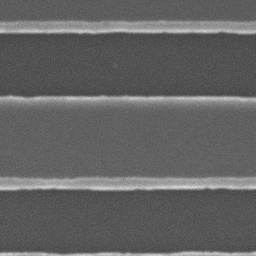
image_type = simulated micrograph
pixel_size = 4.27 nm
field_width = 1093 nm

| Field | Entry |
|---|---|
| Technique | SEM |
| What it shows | lines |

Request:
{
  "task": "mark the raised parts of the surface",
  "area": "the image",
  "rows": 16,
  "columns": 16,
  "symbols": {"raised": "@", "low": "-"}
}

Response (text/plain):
@@@@@@@@@@@@@@@@
@@@@@@@@@@@@@@@@
----------------
----------------
----------------
----------------
@@@@@@@@@@@@@@@@
@@@@@@@@@@@@@@@@
@@@@@@@@@@@@@@@@
@@@@@@@@@@@@@@@@
@@@@@@@@@@@@@@@@
@@@@@@@@@@@@@@@@
----------------
----------------
----------------
----------------